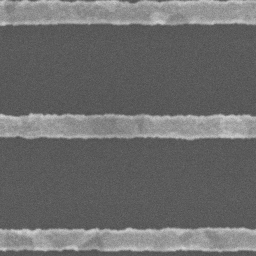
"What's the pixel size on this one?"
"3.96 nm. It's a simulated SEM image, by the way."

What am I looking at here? lines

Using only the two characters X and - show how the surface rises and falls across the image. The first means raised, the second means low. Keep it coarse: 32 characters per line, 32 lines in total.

XXXXXXXXXXXXXXXX-XXXXXXXXXXXXXXX
XXXXXXXXXXXXXXXXXXXXXXXXXXXXXXXX
XXXXXXXXXXXXXXXXXXXXXXXXXXXXXXXX
--------------------------------
--------------------------------
--------------------------------
--------------------------------
--------------------------------
--------------------------------
--------------------------------
--------------------------------
--------------------------------
--------------------------------
--------------------------------
--------X----XX------------X----
XXXXXXXXXXXXXXXXXXXXXXXXXXXXXXXX
XXXXXXXXXXXXXXXXXXXXXXXXXXXXXXXX
--------------------------------
--------------------------------
--------------------------------
--------------------------------
--------------------------------
--------------------------------
--------------------------------
--------------------------------
--------------------------------
--------------------------------
--------------------------------
--------------------------------
XXXXXXXXXXXXXXXXXXXXXXXXXXXXXXXX
XXXXXXXXXXXXXXXXXXXXXXXXXXXXXXXX
--------------------------------